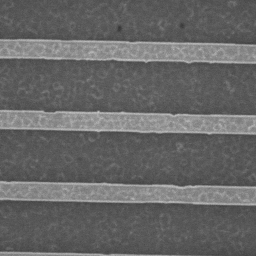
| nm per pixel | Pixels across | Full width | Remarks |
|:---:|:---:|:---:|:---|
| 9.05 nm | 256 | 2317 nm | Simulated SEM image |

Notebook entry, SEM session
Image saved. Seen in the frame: one or a few lines or trenches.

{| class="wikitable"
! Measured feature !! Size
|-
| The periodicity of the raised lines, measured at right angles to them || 643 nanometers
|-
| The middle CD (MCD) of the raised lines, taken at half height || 158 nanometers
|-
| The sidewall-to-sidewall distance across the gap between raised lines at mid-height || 0.486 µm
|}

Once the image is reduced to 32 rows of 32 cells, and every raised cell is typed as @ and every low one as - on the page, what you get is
--------------------------------
--------------------------------
--------------------------------
--------------------------------
--------------------------------
@@@@@@@@@@@@@@@@@@@@@@@@@-------
@@@@@@@@@@@@@@@@@@@@@@@@@@@@@@@@
----------------@-@--@@@@@@@@@@@
--------------------------------
--------------------------------
--------------------------------
--------------------------------
--------------------------------
--------------------------------
@@@@@@@@@@@@@@@@@@@@@@@@---@@---
@@@@@@@@@@@@@@@@@@@@@@@@@@@@@@@@
-------------------------@@@@@@@
--------------------------------
--------------------------------
--------------------------------
--------------------------------
--------------------------------
--------------------------------
@@@@@@@@@@@@@@@@@@@@@@@@@@@@@---
@@@@@@@@@@@@@@@@@@@@@@@@@@@@@@@@
-----------------------------@@@
--------------------------------
--------------------------------
--------------------------------
--------------------------------
--------------------------------
--------------------------------